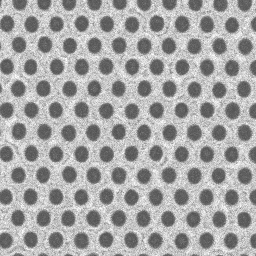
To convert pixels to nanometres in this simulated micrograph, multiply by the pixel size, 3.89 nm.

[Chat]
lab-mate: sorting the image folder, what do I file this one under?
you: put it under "a regular array of holes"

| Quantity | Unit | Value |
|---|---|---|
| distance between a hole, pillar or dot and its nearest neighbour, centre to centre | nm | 95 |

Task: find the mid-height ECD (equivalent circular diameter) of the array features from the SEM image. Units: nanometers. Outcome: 55.4